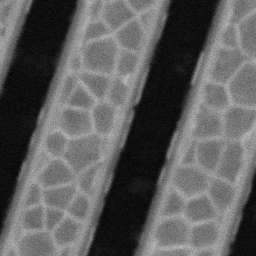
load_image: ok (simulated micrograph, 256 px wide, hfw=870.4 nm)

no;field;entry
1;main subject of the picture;one or a few lines or trenches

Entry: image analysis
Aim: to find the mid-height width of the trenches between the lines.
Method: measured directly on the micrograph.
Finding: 224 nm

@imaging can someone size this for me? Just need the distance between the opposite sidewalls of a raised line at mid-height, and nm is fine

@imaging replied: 230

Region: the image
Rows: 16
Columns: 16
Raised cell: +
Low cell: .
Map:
+....+++++....++
+....+++++....++
.....++++.....++
....+++++....+++
....+++++....+++
....++++.....+++
...+++++....++++
...+++++....++++
...++++.....++++
..+++++....+++++
..+++++....++++.
..++++.....++++.
.+++++....+++++.
.+++++....++++..
.++++.....++++..
+++++....+++++..